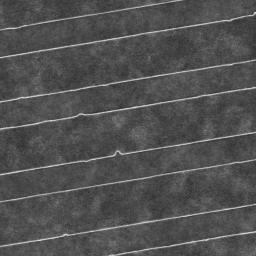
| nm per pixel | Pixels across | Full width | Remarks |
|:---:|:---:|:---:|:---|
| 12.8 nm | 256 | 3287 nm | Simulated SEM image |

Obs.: one or a few lines or trenches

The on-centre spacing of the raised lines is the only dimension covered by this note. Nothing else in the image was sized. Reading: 71.1 px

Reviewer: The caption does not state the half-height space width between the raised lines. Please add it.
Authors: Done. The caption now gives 0.34 um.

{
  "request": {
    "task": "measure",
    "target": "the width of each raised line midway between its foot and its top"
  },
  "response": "44.6 pixels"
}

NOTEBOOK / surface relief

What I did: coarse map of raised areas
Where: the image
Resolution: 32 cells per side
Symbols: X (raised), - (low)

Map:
XXXXXXXXXXXXXXXXXXXX------------
XXXXXXXXXXXXXX------------------
XXXXXXXX---------------------XXX
XX--------------------XXXXXXXXXX
----------------XXXXXXXXXXXXXXXX
----------XXXXXXXXXXXXXXXXXXXXXX
----XXXXXXXXXXXXXXXXXXXXXXXXXXXX
XXXXXXXXXXXXXXXXXXXXXXXXXXXXXXXX
XXXXXXXXXXXXXXXXXXXXXXXXXX------
XXXXXXXXXXXXXXXXXXXX------------
XXXXXXXXXXXXXX------------------
XXXXXXXX--------------------XXXX
XX--------------------XXXXXXXXXX
----------------XXXXXXXXXXXXXXXX
---------XXXXXXXXXXXXXXXXXXXXXXX
----XXXXXXXXXXXXXXXXXXXXXXXXXXXX
XXXXXXXXXXXXXXXXXXXXXXXXXXXXXXXX
XXXXXXXXXXXXXXXXXXXXXXXXXX------
XXXXXXXXXXXXXXXXXXXX------------
XXXXXXXXXXXXXX------------------
XXXXXXXX--------------------XXXX
XX--------------------XXXXXXXXXX
----------------XXXXXXXXXXXXXXXX
----------XXXXXXXXXXXXXXXXXXXXXX
----XXXXXXXXXXXXXXXXXXXXXXXXXXXX
XXXXXXXXXXXXXXXXXXXXXXXXXXXXXXXX
XXXXXXXXXXXXXXXXXXXXXXXXXXX-----
XXXXXXXXXXXXXXXXXXXX------------
XXXXXXXXXXXXXX------------------
XXXXXXXX--------------------XXXX
XX--------------------XXXXXXXXXX
----------------XXXXXXXXXXXXXXXX